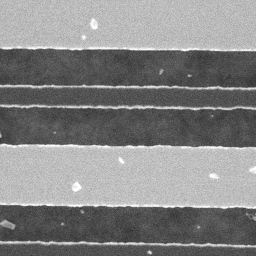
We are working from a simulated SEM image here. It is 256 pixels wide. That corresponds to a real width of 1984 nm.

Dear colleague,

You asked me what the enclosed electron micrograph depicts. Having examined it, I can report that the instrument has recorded lines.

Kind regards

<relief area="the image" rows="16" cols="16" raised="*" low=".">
****************
****************
****************
................
................
************.*..
****************
................
................
****************
****************
****************
****************
................
................
****************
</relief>